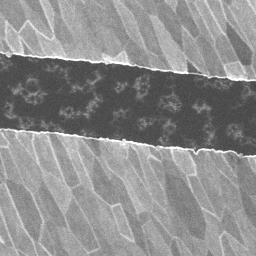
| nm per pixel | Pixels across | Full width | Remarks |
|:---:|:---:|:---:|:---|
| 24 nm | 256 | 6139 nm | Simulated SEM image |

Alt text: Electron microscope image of one or a few lines or trenches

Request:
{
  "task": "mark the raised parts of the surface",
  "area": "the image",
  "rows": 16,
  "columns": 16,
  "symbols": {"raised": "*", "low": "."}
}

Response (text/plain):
****************
****************
****************
..**************
...........*****
................
................
................
*****...........
**************..
****************
****************
****************
****************
****************
****************